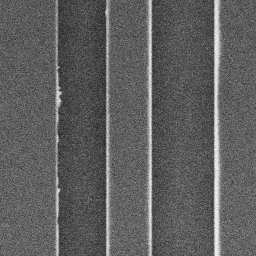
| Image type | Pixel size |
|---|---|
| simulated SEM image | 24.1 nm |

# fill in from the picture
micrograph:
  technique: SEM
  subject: lines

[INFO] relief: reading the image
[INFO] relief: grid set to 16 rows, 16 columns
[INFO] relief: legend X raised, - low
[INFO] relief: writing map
XXXX---XX-----XX
XXXX---XX-----XX
XXXX---XX-----XX
XXXX---XX-----XX
XXXX---XX-----XX
XXXX---XX-----XX
XXXX---XX-----XX
XXXX---XX-----XX
XXXX---XX-----XX
XXXX---XX-----XX
XXXX---XX-----XX
XXXX---XX-----XX
XXXX---XX-----XX
XXXX---XX-----XX
XXXX---XX-----XX
XXXX---XX-----XX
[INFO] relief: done